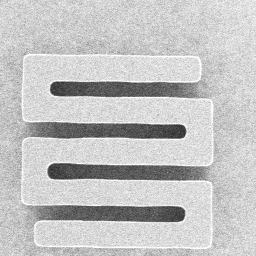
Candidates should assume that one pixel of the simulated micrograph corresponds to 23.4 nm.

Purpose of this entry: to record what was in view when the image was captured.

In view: groups of lines, slits or small figures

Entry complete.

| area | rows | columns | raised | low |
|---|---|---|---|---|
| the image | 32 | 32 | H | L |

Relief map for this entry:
LLLLLLLLLLLLLLLLLLLLLLLLLLLLLLLL
LLLLLLLLLLLLLLLLLLLLLLLLLLLLLLLL
LLLLLLLLLLLLLLLLLLLLLLLLLLLLLLLL
LLLLLLLLLLLLLLLLLLLLLLLLLLLLLLLL
LLLLLLLLLLLLLLLLLLLLLLLLLLLLLLLL
LLLLLLLLLLLLLLLLLLLLLLLLLLLLLLLL
LLLLLLLLLLLLLLLLLLLLLLLLLLLLLLLL
LLLHHHHHHHHHHHHHHHHHHHHHHLLLLLLL
LLLHHHHHHHHHHHHHHHHHHHHHHLLLLLLL
LLLHHHHHHHHHHHHHHHHHHHHHHLLLLLLL
LLLHHHLLLLLLLLLLLLLLLLLLLLLLLLLL
LLLHHHLLLLLLLLLLLLLLLLLLLLLLLLLL
LLLHHHHHHHHHHHHHHHHHHHHHHHLLLLLL
LLLHHHHHHHHHHHHHHHHHHHHHHHHLLLLL
LLLHHHHHHHHHHHHHHHHHHHHHHHHLLLLL
LLLLLLLLLLLLLLLLLLLLLLHHHHHLLLLL
LLLLLLLLLLLLLLLLLLLLLLLHHHHLLLLL
LLLHHHHHHHHHHHHHHHHHHHHHHHHLLLLL
LLLHHHHHHHHHHHHHHHHHHHHHHHHLLLLL
LLLHHHHHHHHHHHHHHHHHHHHHHHHLLLLL
LLLHHHLLLLLLLHHHHHHHHHHHHHLLLLLL
LLLHHHLLLLLLLLLLLLLLLLLLLLLLLLLL
LLLHHHHLLLHHLLLLLLLLLLLLLLLLLLLL
LLLHHHHHHHHHHHHHHHHHHHHHHHLLLLLL
LLLHHHHHHHHHHHHHHHHHHHHHHHLLLLLL
LLLHHHHHHHHHHHHHHHHHHHHHHHLLLLLL
LLLLLLLLLLLLLLLLLLLLLLLHHHLLLLLL
LLLLLLLLLLLLLLLLLLLLLLLHHHLLLLLL
LLLLHHHHHHHHHHHHHHHHHHHHHHLLLLLL
LLLLHHHHHHHHHHHHHHHHHHHHHHLLLLLL
LLLLLHHHHHHHHHHHHHHHHHHHHHLLLLLL
LLLLLLLLLLLLLLLLLLLLLLLLLLLLLLLL